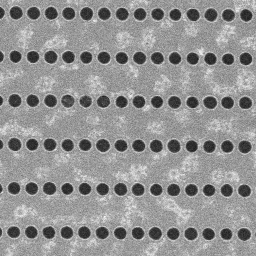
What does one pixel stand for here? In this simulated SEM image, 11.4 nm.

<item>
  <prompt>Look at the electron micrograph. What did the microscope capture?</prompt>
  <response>a regular array of holes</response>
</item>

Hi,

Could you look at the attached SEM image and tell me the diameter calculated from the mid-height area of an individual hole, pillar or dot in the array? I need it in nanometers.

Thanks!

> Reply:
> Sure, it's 146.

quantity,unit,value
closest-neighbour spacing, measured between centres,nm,199